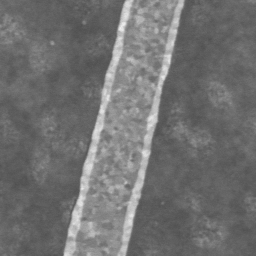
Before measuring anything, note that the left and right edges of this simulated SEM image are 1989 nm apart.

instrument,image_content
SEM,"one or a few lines or trenches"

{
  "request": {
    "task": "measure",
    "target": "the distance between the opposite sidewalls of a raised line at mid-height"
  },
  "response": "0.411 µm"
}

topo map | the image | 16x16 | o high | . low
........ooo.....
........ooo.....
.......oooo.....
.......ooo......
.......ooo......
.......ooo......
......oooo......
......ooo.......
......ooo.......
......ooo.......
.....oooo.......
.....oooo.......
.....ooo........
.....ooo........
.....ooo........
....oooo........